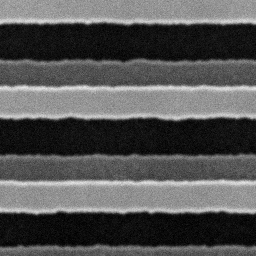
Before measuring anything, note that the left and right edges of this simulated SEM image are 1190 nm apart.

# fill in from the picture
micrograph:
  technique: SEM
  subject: lines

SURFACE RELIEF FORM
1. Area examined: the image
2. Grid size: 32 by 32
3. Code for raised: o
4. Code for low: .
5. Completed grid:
oooooooooooooooooooooooooooooooo
oooooooooooooooooooooooooooooooo
oooooooooooooooooooooooooooooooo
................................
................................
................................
................................
.................o..............
oooooooooooooooooooooooooooooooo
oooooooooooooooooooooooooooooooo
oooooooooooooooooooooooooooooooo
oooooooooooooooooooooooooooooooo
oooooooooooooooooooooooooooooooo
oooooooooooooooooooooooooooooooo
oooooooooooooooooooooooooooooooo
................................
................................
................................
................................
.o.oo......oo...o..o..o....oo.oo
oooooooooooooooooooooooooooooooo
oooooooooooooooooooooooooooooooo
oooooooooooooooooooooooooooooooo
oooooooooooooooooooooooooooooooo
oooooooooooooooooooooooooooooooo
oooooooooooooooooooooooooooooooo
.oooooo.......oo..oo.oo.o...oooo
................................
................................
................................
................................
oooooooooooooooooooooooooooooooo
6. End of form